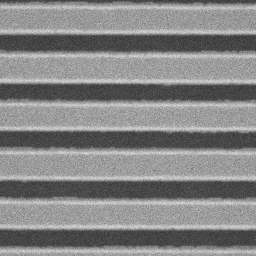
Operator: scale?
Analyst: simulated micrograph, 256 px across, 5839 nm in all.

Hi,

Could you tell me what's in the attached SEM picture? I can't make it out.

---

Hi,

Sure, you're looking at lines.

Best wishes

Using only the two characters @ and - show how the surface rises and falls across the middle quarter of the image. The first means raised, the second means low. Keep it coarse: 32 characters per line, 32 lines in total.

@@@@@@@@@@@@@@@@@@@@@@@@@@@@@@@@
@@@@@@@@@@@@@@@@@@@@@@@@@@@@@@@@
@@@@@@@@@@@@@@@@@@@@@@@@@@@@@@@@
@@@@@@@@@@@@@@@@@@@@@@@@@@@@@@@@
@@@@@@@@@@@@@@@@@@@@@@@@@@@@@@@@
--------------------------------
--------------------------------
--------------------------------
--------------------------------
--------------------------------
@@@@@@@@@@@@@@@@@@@@@@@@@@@@@@@@
@@@@@@@@@@@@@@@@@@@@@@@@@@@@@@@@
@@@@@@@@@@@@@@@@@@@@@@@@@@@@@@@@
@@@@@@@@@@@@@@@@@@@@@@@@@@@@@@@@
@@@@@@@@@@@@@@@@@@@@@@@@@@@@@@@@
@@@@@@@@@@@@@@@@@@@@@@@@@@@@@@@@
@@@-@@@@@@@@@@@@@@@@@@@@@@@@@@@@
--------------------------------
--------------------------------
--------------------------------
--------------------------------
--------------------------------
@@@@@@@@@@@@@@@@@@@@@@@@@@@@@@@@
@@@@@@@@@@@@@@@@@@@@@@@@@@@@@@@@
@@@@@@@@@@@@@@@@@@@@@@@@@@@@@@@@
@@@@@@@@@@@@@@@@@@@@@@@@@@@@@@@@
@@@@@@@@@@@@@@@@@@@@@@@@@@@@@@@@
@@@@@@@@@@@@@@@@@@@@@@@@@@@@@@@@
@@@@@@@@@@@@@@@@@@@@@@@@@@@@@@@@
--------------------------------
--------------------------------
--------------------------------